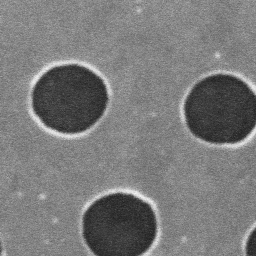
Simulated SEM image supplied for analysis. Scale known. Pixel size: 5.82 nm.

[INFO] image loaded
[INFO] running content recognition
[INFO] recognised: holes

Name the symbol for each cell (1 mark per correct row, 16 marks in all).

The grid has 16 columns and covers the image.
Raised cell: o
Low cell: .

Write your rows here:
oooooooooooooooo
oooooooooooooooo
oooooooooooooooo
oooooooooooooooo
ooo...oooooooooo
oo.....ooooo....
oo.....oooo.....
oo....oooooo....
oooooooooooo....
oooooooooooooooo
oooooooooooooooo
oooooooooooooooo
oooooo...ooooooo
ooooo.....oooooo
ooooo.....oooooo
oooooo...oooooo.